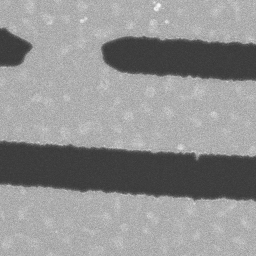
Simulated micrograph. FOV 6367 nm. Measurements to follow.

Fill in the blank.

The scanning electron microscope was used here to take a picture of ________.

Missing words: one or a few lines or trenches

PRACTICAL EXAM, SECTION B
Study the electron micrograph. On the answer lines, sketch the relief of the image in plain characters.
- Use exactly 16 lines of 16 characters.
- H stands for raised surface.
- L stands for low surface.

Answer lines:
LLLLLLLLLLLLLLLL
LLLLLLLLLLLLLLLL
HHLLLLLHHHHHHLLL
HHLLLLHHHHHHHHHH
LLLLLLLHHHHHHHHH
LLLLLLLLLLLLLLLL
LLLLLLLLLLLLLLLL
LLLLLLLLLLLLLLLL
LLLLLLLLLLLLLLLL
HHHHHHHHHHHHLLLL
HHHHHHHHHHHHHHHH
HHHHHHHHHHHHHHHH
LLLLLLLLLLLLHHHH
LLLLLLLLLLLLLLLL
LLLLLLLLLLLLLLLL
LLLLLLLLLLLLLLLL